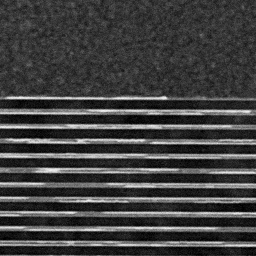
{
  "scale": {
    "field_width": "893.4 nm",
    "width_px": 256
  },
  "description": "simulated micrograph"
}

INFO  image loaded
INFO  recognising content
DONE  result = parallel lines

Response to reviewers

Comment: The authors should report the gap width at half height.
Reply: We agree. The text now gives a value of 0.0349 microns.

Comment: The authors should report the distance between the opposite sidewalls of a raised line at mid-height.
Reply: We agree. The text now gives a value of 17.5 nanometers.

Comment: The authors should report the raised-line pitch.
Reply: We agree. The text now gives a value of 14.7 pixels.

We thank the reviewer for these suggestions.